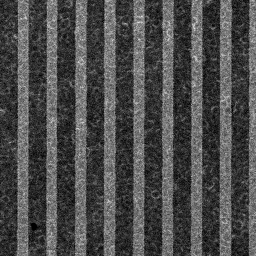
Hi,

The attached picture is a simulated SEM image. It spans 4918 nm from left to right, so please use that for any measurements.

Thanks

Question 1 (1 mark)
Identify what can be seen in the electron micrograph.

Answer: parallel lines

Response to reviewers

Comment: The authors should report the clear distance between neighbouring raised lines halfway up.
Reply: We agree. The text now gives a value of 0.363 micrometres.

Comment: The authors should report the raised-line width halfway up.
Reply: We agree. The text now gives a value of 10 pixels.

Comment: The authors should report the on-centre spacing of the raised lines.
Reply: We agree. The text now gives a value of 556 nanometres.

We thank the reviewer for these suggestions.